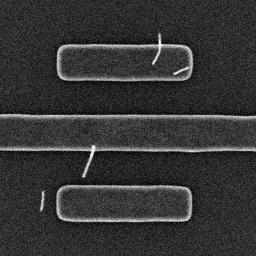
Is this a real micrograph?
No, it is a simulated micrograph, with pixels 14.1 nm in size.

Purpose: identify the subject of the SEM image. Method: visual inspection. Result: groups of lines, slits or small figures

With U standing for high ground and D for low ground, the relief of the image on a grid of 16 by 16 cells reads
DDDDDDDDDDDDDDDD
DDDDDDDDDDDDDDDD
DDDDDDDDDDDDDDDD
DDDDUUUUUUUUDDDD
DDDDUUUUUUUUDDDD
DDDDDDDDDDDDDDDD
DDDDDDDDDDDDDDDD
UUUUUUUUUUUUUUUU
UUUUUUUUUUUUUUUU
DDDDDDDDDDDDDDDD
DDDDDDDDDDDDDDDD
DDDDDDDDDDDDDDDD
DDDDUUUUUUUUDDDD
DDDDUUUUUUUUDDDD
DDDDDDDDDDDDDDDD
DDDDDDDDDDDDDDDD